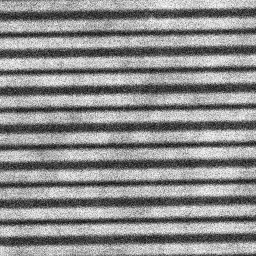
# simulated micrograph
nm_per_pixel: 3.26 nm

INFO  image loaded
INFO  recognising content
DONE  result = parallel lines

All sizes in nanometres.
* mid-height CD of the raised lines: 33.4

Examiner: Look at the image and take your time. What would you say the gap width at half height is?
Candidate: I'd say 30.2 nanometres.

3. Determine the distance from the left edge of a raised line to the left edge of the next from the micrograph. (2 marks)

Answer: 0.061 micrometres